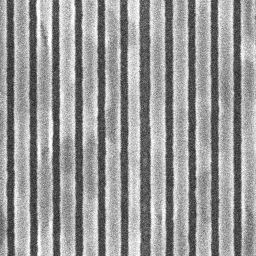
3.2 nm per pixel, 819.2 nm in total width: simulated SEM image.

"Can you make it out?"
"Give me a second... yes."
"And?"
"parallel lines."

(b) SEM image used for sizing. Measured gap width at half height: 27.6 nm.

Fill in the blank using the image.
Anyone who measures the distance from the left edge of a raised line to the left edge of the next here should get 0.0725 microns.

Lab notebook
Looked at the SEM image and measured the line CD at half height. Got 45.9 nanometers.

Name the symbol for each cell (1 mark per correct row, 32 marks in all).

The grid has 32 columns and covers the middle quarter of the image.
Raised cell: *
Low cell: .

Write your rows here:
***..***..****..***...***..****.
**...***..****..***...***..****.
***..***..****..***...***..****.
***..***..****..***...***...***.
***..***..****..***...***...***.
***..***..****..***...***...***.
***..***..****..***...***...***.
***..***..****..***...***...***.
***..***..****..***...***...***.
***..***...***..***...***...***.
***..***...***..***...***...***.
***..***..****..***...***...***.
**...***...***..***...***...***.
***..***..****..***...***...***.
***..***...***..***...***...***.
***..***...***..***...***...***.
***..***...***..***...***...***.
***..***...***..***...***...***.
**...***...***..***...***...***.
***..***...***..***...***...***.
***..***...***..***...***..****.
***..***...***..***...***..****.
***..***...***..***...***...***.
***..***...***..***...***...***.
***..***...***..***...***...***.
***..***...***..***...***...***.
***..***...***..***...***...***.
***..***...***..***...***...***.
***..***...***..***...***...***.
***..***...***..***...***...***.
***..***...***..***...***...***.
***..***...***..***...***...***.